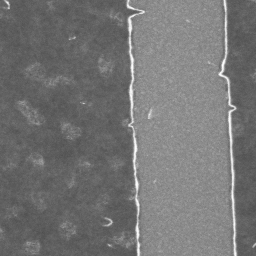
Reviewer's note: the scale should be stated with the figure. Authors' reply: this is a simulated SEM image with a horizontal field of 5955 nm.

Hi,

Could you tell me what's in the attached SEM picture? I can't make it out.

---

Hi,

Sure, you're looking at one or a few lines or trenches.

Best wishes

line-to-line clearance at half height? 2240 nanometres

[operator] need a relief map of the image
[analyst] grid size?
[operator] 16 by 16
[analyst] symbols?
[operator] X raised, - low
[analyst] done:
XXXXXXXX------XX
XXXXXXXX------XX
XXXXXXXX------XX
XXXXXXXX------XX
XXXXXXXX------XX
XXXXXXXX------XX
XXXXXXXX------XX
XXXXXXXX------XX
XXXXXXXX------XX
XXXXXXXX------XX
XXXXXXXX-------X
XXXXXXXXX------X
XXXXXXXXX------X
XXXXXXXXX------X
XXXXXXXXX------X
XXXXXXXXX------X